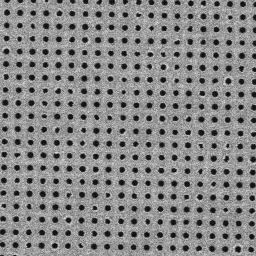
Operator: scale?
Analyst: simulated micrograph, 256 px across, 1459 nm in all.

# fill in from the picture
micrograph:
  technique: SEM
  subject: a regular array of holes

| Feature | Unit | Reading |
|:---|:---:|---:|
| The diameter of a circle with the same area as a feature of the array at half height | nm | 30.8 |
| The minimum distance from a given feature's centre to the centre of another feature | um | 0.0714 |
